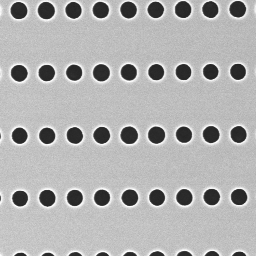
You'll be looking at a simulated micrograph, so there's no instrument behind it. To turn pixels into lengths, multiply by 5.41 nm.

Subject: a regular array of holes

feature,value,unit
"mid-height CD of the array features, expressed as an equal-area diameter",89.2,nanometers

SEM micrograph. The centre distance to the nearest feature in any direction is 147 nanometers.